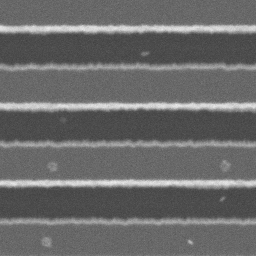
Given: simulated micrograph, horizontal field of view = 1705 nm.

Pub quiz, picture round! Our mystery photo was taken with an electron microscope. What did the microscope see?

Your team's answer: lines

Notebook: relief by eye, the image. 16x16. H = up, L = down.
HHHHHHHHHHHHHHHH
HHHHHHHHHHHHHHHH
LLLLLLLLLLLLLLLL
LLLLLLLLLLLLLLLL
HHHHHHHHHHHHHHHH
HHHHHHHHHHHHHHHH
HHHHHHHHHHHHHHHH
LLLLLLLLLLLLLLLL
LLLLLLLLLLLLLLLL
HHHHHHHHHHHHHHHH
HHHHHHHHHHHHHHHH
HHHHHHHHHHHHHHHH
LLLLLLLLLLLLLLLL
LLLLLLLLLLLLLLLL
HHHHHHHHHHHHHHHH
HHHHHHHHHHHHHHHH